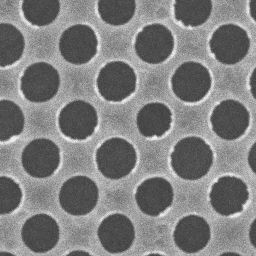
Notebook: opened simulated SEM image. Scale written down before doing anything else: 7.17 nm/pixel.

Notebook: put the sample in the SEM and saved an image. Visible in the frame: a regular array of holes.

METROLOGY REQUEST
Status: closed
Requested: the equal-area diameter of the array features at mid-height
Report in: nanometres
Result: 286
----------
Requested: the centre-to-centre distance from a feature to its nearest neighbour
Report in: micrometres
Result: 0.381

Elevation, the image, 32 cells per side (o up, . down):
ooo....ooooo.....ooooo....ooooo.
ooo....ooooo.....ooooo....ooooo.
ooo....oooooo...oooooo....oooooo
..ooooooo..ooooooo...oooooo...oo
...ooooo....ooooo.....ooooo....o
...oooo.....ooooo.....oooo.....o
...ooooo....ooooo.....oooo.....o
..oooooo...ooooooo...oooooo...oo
ooo....oooooo....ooooo....oooooo
ooo....ooooo.....ooooo....ooooo.
ooo....ooooo.....oooo.....ooooo.
ooo....ooooo.....ooooo....ooooo.
.oo...ooooooo..oooooooo..ooo.ooo
...ooooo....oooooo...oooooo....o
...oooo.....ooooo....ooooo.....o
...oooo.....ooooo....ooooo.....o
...ooooo....ooooo....oooooo....o
.ooo..ooooooo...ooooooo..ooo.ooo
ooo....ooooo.....ooooo....ooooo.
ooo....ooooo.....oooo......oooo.
ooo....ooooo.....oooo......oooo.
ooo....oooooo...oooooo....oooooo
..oooooo...ooooooo...oooooo...oo
...ooooo....ooooo.....oooo.....o
...oooo.....ooooo.....oooo.....o
..oooooo....ooooo....ooooo.....o
.ooooooo...ooooooo..ooooooo...oo
ooo....oooooo...ooooooo...oooooo
ooo....ooooo.....ooooo....ooooo.
ooo....ooooo.....ooooo....ooooo.
ooo....oooooo....ooooo....ooooo.
.ooo..ooo..ooo.oooooooo..ooooooo